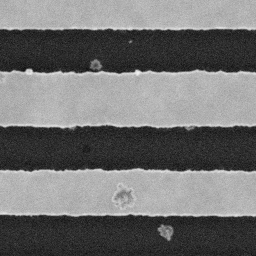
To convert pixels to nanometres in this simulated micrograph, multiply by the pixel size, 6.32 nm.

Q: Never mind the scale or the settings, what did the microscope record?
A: lines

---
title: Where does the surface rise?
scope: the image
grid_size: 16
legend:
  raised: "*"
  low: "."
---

****************
****************
................
................
.*..........*...
****************
****************
****************
................
................
................
****************
****************
................
................
................